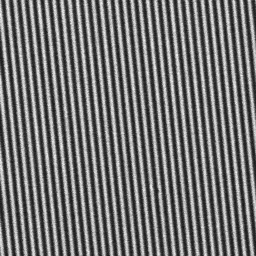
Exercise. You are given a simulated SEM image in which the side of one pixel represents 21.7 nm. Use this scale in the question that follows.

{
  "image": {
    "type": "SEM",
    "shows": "parallel lines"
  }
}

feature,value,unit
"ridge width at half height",56.6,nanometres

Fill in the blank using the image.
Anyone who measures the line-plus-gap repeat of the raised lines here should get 7.77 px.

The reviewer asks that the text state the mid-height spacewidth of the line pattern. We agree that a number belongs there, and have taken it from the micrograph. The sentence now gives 111 nm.